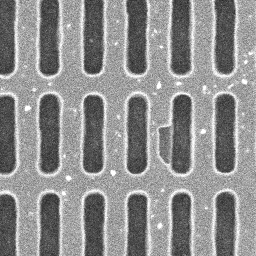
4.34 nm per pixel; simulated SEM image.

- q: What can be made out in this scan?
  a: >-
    holes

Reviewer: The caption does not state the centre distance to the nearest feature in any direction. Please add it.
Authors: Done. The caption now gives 188 nm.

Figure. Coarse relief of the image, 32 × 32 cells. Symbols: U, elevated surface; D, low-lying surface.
DDUUUDDUUUDDDUUUDDUUUDDDUUUDDUUU
DDUUUDDUUUDDDUUUDDUUUDDDUUUDDDUU
DDUUUDDUUUDDDUUUDDUUUDDDUUUDDUUU
DDUUUDDUUUDDDUUUDDUUUDDDUUUDDUUU
DDUUUDDUUUDDDUUUDDUUUDDDUUUDDUUU
DDUUUDDUUUDDDUUUDDUUUDDDUUUDDUUU
DDUUUDDDUUDDDUUUDDUUUDDDUUUDDUUU
DDUUUDDDUUDDDUUUDDUUUDDDUUUDDUUU
DDUUUDDUUUDDDUUUDDUUUDDDUUUDDUUU
UUUUUUDUUUUUUUUUUUUUUUUUUUUUUUUU
UUUUUUUUUUUUUUUUUUUUUUUUUUUUUUUU
UUUUUUUUUUUUUUUUUUUUUUUUUUUUUUUU
DDUUUDDUUUUDDUUUDDUUUUDDUUUDDUUU
DDUUUDDDUUDDDUUUDDUUUUDDUUUDDDUU
DDUUUDDDUUDDDUUUDDUUUUDDUUUDDDUU
DDUUUDDDUUDDDUUUDDUUUDDDUUUDDDUU
DDUUUDDDUUDDDUUUDDUUDDDDUUUDDUUU
DDUUUDDUUUDDDUUUDDUUDDDDUUUDDDUU
DDUUUDDUUUDDDUUUDDUUDDDDUUUDDDUU
DDUUUDDUUUDDDUUUDDUUDDDDUUUDDDUU
DDUUUDDUUUDDDUUUDDUUUDDDUUUDDDUU
DDUUUDDUUUUDUUUUDDUUUUDDUUUUDUUU
UUUUUUUUUUUUUUUUUUUUUUUUUUUUUUUU
UUUUUUUUUUUUUUUUUUUUUUUUUUUUUUUU
DUUUUDDUUUUDDUUUDDUUUUDDUUUDDUUU
DDUUUDDUUUDDDUUUDDUUUDDDUUUDDDUU
DDUUUDDUUUDDDUUUDDUUUDDDUUUDDUUU
DDUUUDDDUUDDDUUUDDUUUDDDUUUDDDUU
DDUUUDDDUUUDDUUUDDUUUDDDUUUDDDUU
DDUUUDDDUUUDDUUUDDUUUDDDUUUDDDUU
DDUUUDDDUUUDDUUUDDUUUDDDUUUDDUUU
DDUUUDDDUUUDDUUUDDUUUDDDUUUDDUUU